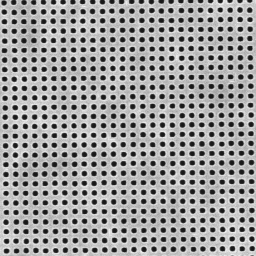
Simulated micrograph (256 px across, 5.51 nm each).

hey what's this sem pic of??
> a regular array of holes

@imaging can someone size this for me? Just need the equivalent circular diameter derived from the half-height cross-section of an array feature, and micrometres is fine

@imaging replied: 0.0311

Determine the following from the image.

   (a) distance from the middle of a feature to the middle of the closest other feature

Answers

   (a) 0.0507 microns